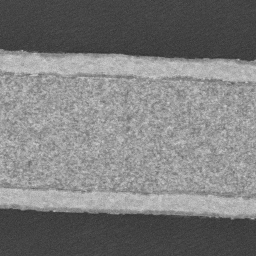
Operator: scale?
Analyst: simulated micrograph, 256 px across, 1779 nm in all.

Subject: one or a few lines or trenches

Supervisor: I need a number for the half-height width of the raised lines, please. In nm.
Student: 926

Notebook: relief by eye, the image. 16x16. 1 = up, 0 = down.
0000000000000000
0000000000000000
0000000000000000
0000000000000000
1111111111111100
1111111111111111
1111111111111111
1111111111111111
1111111111111111
1111111111111111
1111111111111111
1111111111111111
0000111111111111
0000000000000000
0000000000000000
0000000000000000